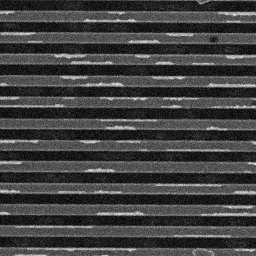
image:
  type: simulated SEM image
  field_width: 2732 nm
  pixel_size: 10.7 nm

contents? parallel lines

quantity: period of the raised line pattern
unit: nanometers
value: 229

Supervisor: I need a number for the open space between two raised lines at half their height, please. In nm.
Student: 123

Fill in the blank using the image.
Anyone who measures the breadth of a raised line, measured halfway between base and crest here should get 113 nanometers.